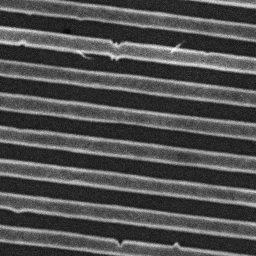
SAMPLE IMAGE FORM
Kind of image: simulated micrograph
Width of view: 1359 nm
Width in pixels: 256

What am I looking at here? parallel lines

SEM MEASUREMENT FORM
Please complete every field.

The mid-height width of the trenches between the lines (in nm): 97.5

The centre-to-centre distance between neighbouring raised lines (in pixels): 32.8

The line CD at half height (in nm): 79.7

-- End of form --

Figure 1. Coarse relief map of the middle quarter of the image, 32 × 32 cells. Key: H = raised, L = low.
LLLLLLLLLLLLLLLLLLLLLLLLLLLLLLLL
HHLLLLLLLLLLLLLLLLLLLLLLLLLLLLLL
HHHHHHHHHHHHLLLLLLLLLLLLLLLLLLLL
HHHHHHHHHHHHHHHHHHHHHHLLLLLLLLLL
HHHHHHHHHHHHHHHHHHHHHHHHHHHHLLLL
LLLLLLLHHHHHHHHHHHHHHHHHHHHHHHHH
LLLLLLLLLLLLLLLLHHHHHHHHHHHHHHHH
LLLLLLLLLLLLLLLLLLLLLLLHHHHHHHHH
LLLLLLLLLLLLLLLLLLLLLLLLLLLLLLLH
LLLLLLLLLLLLLLLLLLLLLLLLLLLLLLLL
HHHHHHHHLLLLLLLLLLLLLLLLLLLLLLLL
HHHHHHHHHHHHHHHHLLLLLLLLLLLLLLLL
HHHHHHHHHHHHHHHHHHHHHHHHLLLLLLLL
LLLHHHHHHHHHHHHHHHHHHHHHHHHHHHHH
LLLLLLLLLLLLLHHHHHHHHHHHHHHHHHHH
LLLLLLLLLLLLLLLLLLLLLHHHHHHHHHHH
LLLLLLLLLLLLLLLLLLLLLLLLLLLLLHHH
LLLLLLLLLLLLLLLLLLLLLLLLLLLLLLLL
HHHHHHLLLLLLLLLLLLLLLLLLLLLLLLLL
HHHHHHHHHHHHHHHHLLLLLLLLLLLLLLLL
HHHHHHHHHHHHHHHHHHHHHHHHLLLLLLLL
LHHHHHHHHHHHHHHHHHHHHHHHHHHHHHHL
LLLLLLLLLHHHHHHHHHHHHHHHHHHHHHHH
LLLLLLLLLLLLLLLLLLLHHHHHHHHHHHHH
LLLLLLLLLLLLLLLLLLLLLLLLLHHHHHHH
LLLLLLLLLLLLLLLLLLLLLLLLLLLLLLLL
HHHHHHLLLLLLLLLLLLLLLLLLLLLLLLLL
HHHHHHHHHHHHHLLLLLLLLLLLLLLLLLLL
HHHHHHHHHHHHHHHHHHHHLLLLLLLLLLLL
LHHHHHHHHHHHHHHHHHHHHHHHHHHHHLLL
LLLLLLLLLHHHHHHHHHHHHHHHHHHHHHHH
LLLLLLLLLLLLLLLHHHHHHHHHHHHHHHHH